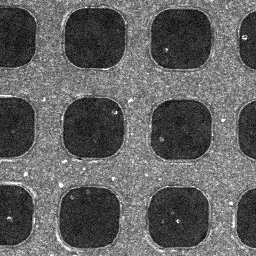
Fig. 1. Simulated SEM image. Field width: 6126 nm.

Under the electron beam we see raised bodies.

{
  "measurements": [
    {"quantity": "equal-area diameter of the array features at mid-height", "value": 1580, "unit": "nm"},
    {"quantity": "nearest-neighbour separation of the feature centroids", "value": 2090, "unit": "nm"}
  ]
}